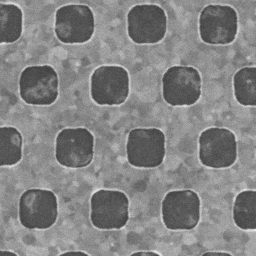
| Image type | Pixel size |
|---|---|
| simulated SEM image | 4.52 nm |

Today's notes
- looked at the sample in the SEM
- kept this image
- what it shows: a regular array of holes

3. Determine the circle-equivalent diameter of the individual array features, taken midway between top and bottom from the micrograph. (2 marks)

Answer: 189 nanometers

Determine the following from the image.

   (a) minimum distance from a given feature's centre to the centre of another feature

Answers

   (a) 320 nm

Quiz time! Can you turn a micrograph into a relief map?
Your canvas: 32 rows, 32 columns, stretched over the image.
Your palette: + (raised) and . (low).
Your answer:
..+++++++.++++++++.+++++++..++++
...++++.....++++.....++++.....++
...++++.....++++.....++++.....++
...++++.....++++.....++++.....++
...++++....+++++.....++++.....++
.++++++++++++++++.++++++++..++++
++++++++++++++++++++++++++++++++
++++++++++++++++++++++++++++++++
+++....+++++...++++++...++++++..
+++....++++.....++++.....++++...
++.....++++.....++++.....++++...
++.....++++.....++++.....++++...
+++....+++++....+++++....+++++..
++++++++++++++++++++++++++++++++
++++++++++++++++++++++++++++++++
++++++++++++++++++++++++++++++++
..+++++....+++++....+++++....+++
...++++.....++++.....++++....+++
...++++.....++++.....++++.....++
...++++.....++++.....++++.....++
..++++++...+++++....+++++....+++
++++++++++++++++++++++++++++++++
++++++++++++++++++++++++++++++++
++++++++++++++++++++++++++++++++
+++....++++.....+++++....+++++..
++.....++++.....++++.....++++...
++.....++++.....++++.....++++...
++.....++++.....++++.....++++...
++++..++++++...++++++...++++++..
++++++++++++++++++++++++++++++++
++++++++++++++++++++++++++++++++
..+++++++.+++++++..++++++++.++++